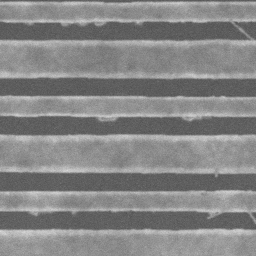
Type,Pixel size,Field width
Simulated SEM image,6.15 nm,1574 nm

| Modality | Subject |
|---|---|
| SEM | lines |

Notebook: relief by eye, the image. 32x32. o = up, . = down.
oooooooooooooooooooooooooooooooo
oooooooooooooooooooooooooooooooo
oooooooooooooooooooooooooooooooo
................................
................................
oooooooooooooooooooooooooooooooo
oooooooooooooooooooooooooooooooo
oooooooooooooooooooooooooooooooo
oooooooooooooooooooooooooooooooo
.oooooooooooooooo.oooooooooooooo
................................
................................
oooooooooooooooooooooooooooooooo
oooooooooooooooooooooooooooooooo
..ooo....oooooooooooooo.........
................................
................................
oooooooooooooooooooooooooooooooo
oooooooooooooooooooooooooooooooo
oooooooooooooooooooooooooooooooo
oooooooooooooooooooooooooooooooo
..........................oo....
................................
................................
oooooooooooooooooooooooooooooooo
oooooooooooooooooooooooooooooooo
...........................o..oo
................................
................................
oooooooooooooooooooooooooooooooo
oooooooooooooooooooooooooooooooo
oooooooooooooooooooooooooooooooo